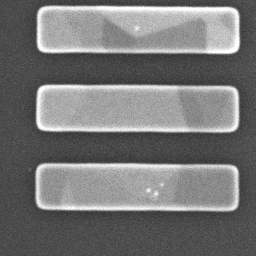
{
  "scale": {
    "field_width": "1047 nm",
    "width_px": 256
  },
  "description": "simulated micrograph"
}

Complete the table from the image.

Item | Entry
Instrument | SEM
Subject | groups of lines, slits or small figures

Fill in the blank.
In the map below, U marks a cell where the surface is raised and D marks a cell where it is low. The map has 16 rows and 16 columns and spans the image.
DDDDDDDDDDDDDDDD
DDUUUUUUUUUUUUUD
DDUUUUUUUUUUUUUD
DDDDDDDDDDDDDDDD
DDDDDDDDDDDDDDDD
DDDUUUUUUUUUUUDD
DDUUUUUUUUUUUUUD
DDUUUUUUUUUUUUUD
DDDDDDDDDDDDDDDD
DDDDDDDDDDDDDDDD
DDDUUUUUUUUUUUDD
DDUUUUUUUUUUUUUD
DDUUUUUUUUUUUUUD
DDDDDDDDDDDDDDDD
DDDDDDDDDDDDDDDD
DDDDDDDDDDDDDDDD